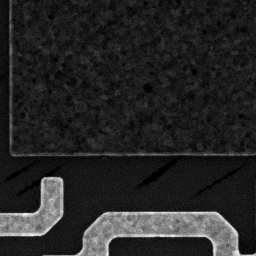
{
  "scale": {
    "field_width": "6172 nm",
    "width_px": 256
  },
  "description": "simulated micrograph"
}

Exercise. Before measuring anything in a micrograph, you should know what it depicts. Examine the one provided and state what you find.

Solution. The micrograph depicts wiring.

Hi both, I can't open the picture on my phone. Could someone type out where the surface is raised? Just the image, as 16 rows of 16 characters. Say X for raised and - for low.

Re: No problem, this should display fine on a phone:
-XXXXXXXXXXXXXXX
-XXXXXXXXXXXXXXX
-XXXXXXXXXXXXXXX
-XXXXXXXXXXXXXXX
-XXXXXXXXXXXXXXX
-XXXXXXXXXXXXXXX
-XXXXXXXXXXXXXXX
-XXXXXXXXXXXXXXX
-XXXXXXXXXXXXXXX
-XXXXXXXXXXXXXXX
----------------
---X------------
---X------------
XXXX--XXXXXXXX--
XXX--XXXXXXXXXX-
-----XX------XX-